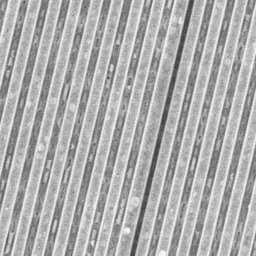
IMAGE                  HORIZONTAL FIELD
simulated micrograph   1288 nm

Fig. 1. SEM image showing parallel lines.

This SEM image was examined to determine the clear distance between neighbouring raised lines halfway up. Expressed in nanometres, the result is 44.7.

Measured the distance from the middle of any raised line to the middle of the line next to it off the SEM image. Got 101 nm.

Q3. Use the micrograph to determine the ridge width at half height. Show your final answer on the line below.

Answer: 57.5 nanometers